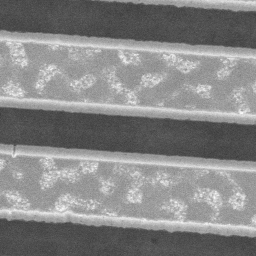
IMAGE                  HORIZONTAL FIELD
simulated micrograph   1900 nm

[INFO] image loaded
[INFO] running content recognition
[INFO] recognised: one or a few lines or trenches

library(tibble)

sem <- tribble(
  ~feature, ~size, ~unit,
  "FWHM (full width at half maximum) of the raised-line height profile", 487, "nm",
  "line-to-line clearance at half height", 352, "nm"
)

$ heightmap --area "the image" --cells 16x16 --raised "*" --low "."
................
................
****............
****************
****************
****************
..**************
................
................
***.............
****************
****************
****************
..**************
................
................